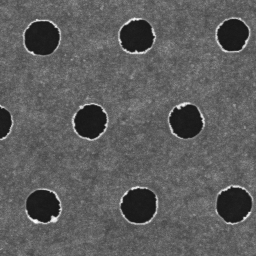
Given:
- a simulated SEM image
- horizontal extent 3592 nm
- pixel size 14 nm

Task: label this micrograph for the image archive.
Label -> a regular array of holes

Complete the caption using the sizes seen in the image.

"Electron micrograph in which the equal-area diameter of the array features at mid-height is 476 nm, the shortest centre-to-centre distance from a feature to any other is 1340 nm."